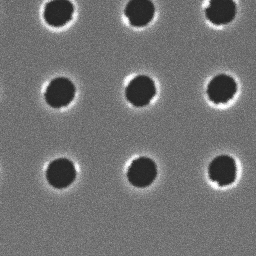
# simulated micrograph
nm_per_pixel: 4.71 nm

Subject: holes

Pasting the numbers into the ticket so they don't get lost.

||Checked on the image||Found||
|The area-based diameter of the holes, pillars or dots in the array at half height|143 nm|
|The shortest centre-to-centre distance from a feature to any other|380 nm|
